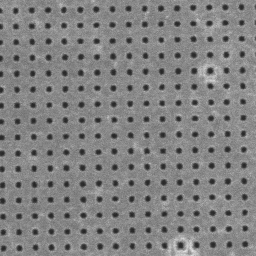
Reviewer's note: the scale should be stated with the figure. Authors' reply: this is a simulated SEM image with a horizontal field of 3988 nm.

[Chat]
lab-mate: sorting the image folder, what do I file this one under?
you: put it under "a regular array of holes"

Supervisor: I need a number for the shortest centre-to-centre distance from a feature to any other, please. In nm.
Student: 244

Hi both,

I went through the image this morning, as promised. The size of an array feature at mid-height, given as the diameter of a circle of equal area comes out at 0.107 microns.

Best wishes